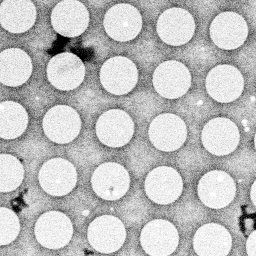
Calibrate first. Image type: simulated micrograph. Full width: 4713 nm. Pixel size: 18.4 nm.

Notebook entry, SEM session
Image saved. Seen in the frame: an array of small figures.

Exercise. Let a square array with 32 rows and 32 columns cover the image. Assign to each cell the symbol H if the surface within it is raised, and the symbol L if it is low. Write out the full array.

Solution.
HHHHLLLHHHLLLLLLLLLLLLLLLLLLLLLL
HHHHLLLHHHHLLHHHHLLLLHHLLLLLLLLL
HHHHLLHHHHHLLHHHHHLLHHHHLLLHHHLL
LHHHLLLHHHHLLHHHHHLLHHHHLLHHHHHL
LLLLLLLLHLLLLLHHHLLLHHHHLLHHHHHL
LLLLLLLLLLLLLLLLLLLLLHHLLLLHHHLL
HHHLLLLLLLLLLLLLLLLLLLLLLLLLLLLL
HHHHLLHHHHLLLLHHLLLLLLLLLLLLLLLL
HHHHLLHHHHHLLHHHHLLLHHHLLLLHHLLL
HHHHLLHHHHLLLHHHHLLHHHHHLLHHHHLL
LHHLLLLHHHLLLHHHHLLHHHHHLLHHHHLL
LLLLLLLLLLLLLLHHLLLLHHHLLLHHHHLL
LLLLLLLLLLLLLLLLLLLLLLLLLLLHHLLL
HHHLLLLHHLLLLLLLLLLLLLLLLLLLLLLL
HHHLLLHHHHLLLHHHLLLLHHLLLLLLLLLL
HHHLLHHHHHLLHHHHHLLHHHHLLLHHHLLL
HHHLLLHHHHLLHHHHHLLHHHHLLHHHHHLL
LLLLLLHHHLLLLHHHLLLHHHHLLHHHHHLL
LLLLLLLLLLLLLLLLLLLLHHLLLLHHHLLL
HLLLLLLLLLLLLLLLLLLLLLLLLLLLLLLL
HHHLLLHHHLLLLHHLLLLLLLLLLLLLLLLL
HHHLLHHHHLLLHHHHLLLHHHLLLLHHLLLL
HHHLLHHHHLLLHHHHLLHHHHHLLHHHHLLL
HHLLLHHHHLLLHHHHLLHHHHHLLHHHHLLH
LLLLLLLLLLLLHHHLLLLHHHLLLHHHHLLH
LLLLLLLLLLLLLLLLLLLLLLLLLLHHLLLL
HHLLLLHLLLLLLLLLLLLLLLLLLLLLLLLL
HHLLLHHHHLLLHHHLLLLLLLLLLLLLLLLL
HHLLHHHHHLLHHHHHLLHHHHLLLHHHLLLL
HHLLLHHHHLLHHHHHLLHHHHLLHHHHHLLH
HLLLLHHHLLLHHHHLLLHHHHLLHHHHHLLH
LLLLLLLLLLLLLHLLLLHHHHLLLHHHHLLH